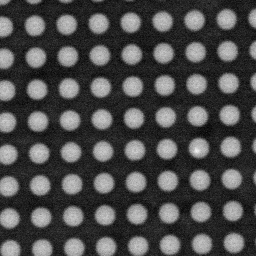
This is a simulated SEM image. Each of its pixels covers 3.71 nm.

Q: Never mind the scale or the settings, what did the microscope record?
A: an array of small figures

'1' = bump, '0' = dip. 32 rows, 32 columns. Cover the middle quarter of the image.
11000000000000000000000000000000
00000000000000000000000000000000
00000000000000000000000000000000
00000000010000001100000011100001
11100001111000011110000111110001
11110001111100011111000111110001
11110001111100011110000111100001
11100001111000001110000011000000
11000000000000000000000000000000
00000000000000000000000000000000
00000000000000000000000000000000
00000000010000001110000011100001
11100000111100011111000111110001
11110001111100011111000111110001
11110001111100011111000111110001
11110000111000001110000011100000
01000000000000000000000000000000
00000000000000000000000000000000
00000000000000000000000000000000
00000000010000001110000011100000
11110000111100001111000111110001
11110001111100011111000111110001
11110001111100011111000011110000
11110000111100001110000001100000
01000000000000000000000000000000
00000000000000000000000000000000
00000000000000000000000000000000
00000000011000000110000011110000
11110000111100001111000011110000
11110000111100001111000011110000
11110000111100001111000011110000
11110000111100001111000001100000